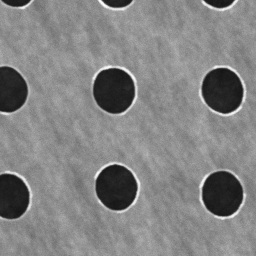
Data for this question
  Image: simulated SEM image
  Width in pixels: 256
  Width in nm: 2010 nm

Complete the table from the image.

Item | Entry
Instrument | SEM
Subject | holes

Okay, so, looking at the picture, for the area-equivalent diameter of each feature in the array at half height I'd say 343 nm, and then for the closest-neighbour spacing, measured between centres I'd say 787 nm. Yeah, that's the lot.